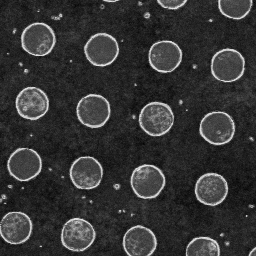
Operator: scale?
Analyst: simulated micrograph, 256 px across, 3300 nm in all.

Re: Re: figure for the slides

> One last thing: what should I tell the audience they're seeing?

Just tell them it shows a regular array of raised bodies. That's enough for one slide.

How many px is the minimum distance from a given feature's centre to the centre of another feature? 61.6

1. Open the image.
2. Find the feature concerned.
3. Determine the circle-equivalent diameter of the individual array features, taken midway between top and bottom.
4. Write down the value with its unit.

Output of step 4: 0.414 microns